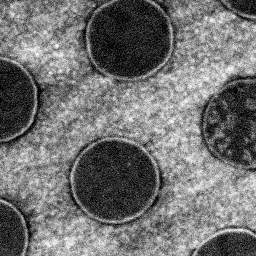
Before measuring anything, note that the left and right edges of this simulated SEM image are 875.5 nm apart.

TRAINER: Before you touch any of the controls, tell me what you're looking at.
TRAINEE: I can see raised bodies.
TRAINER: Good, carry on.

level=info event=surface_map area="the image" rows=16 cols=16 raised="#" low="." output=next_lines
......####....##
......#####.....
.....######.....
......#####.....
##....####......
##..............
##..............
##..............
#...............
.....####.......
.....#####......
....######......
.....#####......
#.....###.......
##............##
##..........####